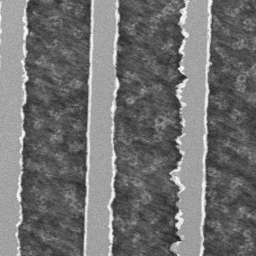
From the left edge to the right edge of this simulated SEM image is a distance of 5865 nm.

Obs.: one or a few lines or trenches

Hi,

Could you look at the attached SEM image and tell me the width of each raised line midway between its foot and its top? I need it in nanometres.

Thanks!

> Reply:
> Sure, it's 558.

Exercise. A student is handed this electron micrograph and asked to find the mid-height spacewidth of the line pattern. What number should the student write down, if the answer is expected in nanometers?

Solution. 1550